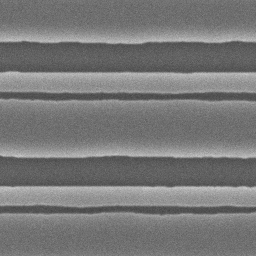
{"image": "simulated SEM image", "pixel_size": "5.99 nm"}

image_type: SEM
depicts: lines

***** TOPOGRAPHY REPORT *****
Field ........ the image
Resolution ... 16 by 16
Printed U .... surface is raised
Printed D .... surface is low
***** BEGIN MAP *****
UUUUUUUUUUUUUUUU
UUUUUUUUUUUUUUUU
UUUUUUUUUUUUUUUU
DDDDDDDDDDDDDDDD
DDDDDDDDDDDDDDDD
UUUUUUUUUUUUUUUU
UUUUUUUUUUUUUUUU
UUUUUUUUUUUUUUUU
UUUUUUUUUUUUUUUU
UUUUUUUUUUUUUUUU
DDDDDDDDDDDDDDDD
DDDDDDDDDDDDDDDD
UUUUUUUUUUUUUUUU
UUUUUUUUUUUUUUUU
UUUUUUUUUUUUUUUU
UUUUUUUUUUUUUUUU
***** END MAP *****